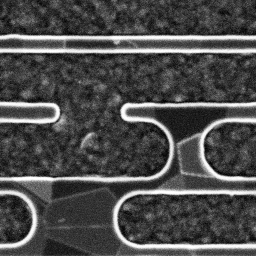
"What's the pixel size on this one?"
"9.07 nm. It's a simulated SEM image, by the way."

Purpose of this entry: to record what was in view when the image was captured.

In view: one or a few lines or trenches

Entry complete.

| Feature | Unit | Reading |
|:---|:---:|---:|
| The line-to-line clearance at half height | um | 0.479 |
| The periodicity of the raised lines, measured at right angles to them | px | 70.1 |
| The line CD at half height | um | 0.134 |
